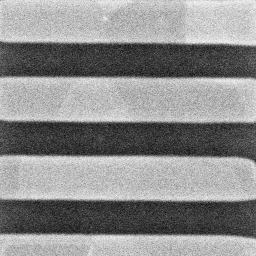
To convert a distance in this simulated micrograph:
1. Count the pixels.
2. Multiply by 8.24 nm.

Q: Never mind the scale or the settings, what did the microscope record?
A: wiring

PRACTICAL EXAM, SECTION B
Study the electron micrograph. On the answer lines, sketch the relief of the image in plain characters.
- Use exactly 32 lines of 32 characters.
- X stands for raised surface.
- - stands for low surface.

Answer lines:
XXXXXXXXXXXXXXXXXXXXXXXXXXXXXXXX
XXXXXXXXXXXXXXXXXXXXXXXXXXXXXXXX
XXXXXXXXXXXXXXXXXXXXXXXXXXXXXXXX
XXXXXXXXXXXXXXXXXXXXXXXXXXXXXXXX
XXXXXXXXXXXXXXXXXXXXXXXXXXXXXXXX
-----------------------------XXX
--------------------------------
--------------------------------
--------------------------------
--------------------------------
XXXXXXXXXXXXXXXXXXXXXXXXXXXXXXXX
XXXXXXXXXXXXXXXXXXXXXXXXXXXXXXXX
XXXXXXXXXXXXXXXXXXXXXXXXXXXXXXXX
XXXXXXXXXXXXXXXXXXXXXXXXXXXXXXXX
XXXXXXXXXXXXXXXXXXXXXXXXXXXXXXXX
--------------------------------
--------------------------------
--------------------------------
--------------------------------
--------------------------------
XXXXXXXXXXXXXXXXXXXXXXXXXXXXXXXX
XXXXXXXXXXXXXXXXXXXXXXXXXXXXXXXX
XXXXXXXXXXXXXXXXXXXXXXXXXXXXXXXX
XXXXXXXXXXXXXXXXXXXXXXXXXXXXXXXX
XXXXXXXXXXXXXXXXXXXXXXXXXXXXXXXX
--------------------------------
--------------------------------
--------------------------------
--------------------------------
XXXXXXXXXXXXXXXXXXXXXXXXXXXXX---
XXXXXXXXXXXXXXXXXXXXXXXXXXXXXXXX
XXXXXXXXXXXXXXXXXXXXXXXXXXXXXXXX